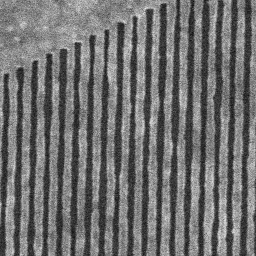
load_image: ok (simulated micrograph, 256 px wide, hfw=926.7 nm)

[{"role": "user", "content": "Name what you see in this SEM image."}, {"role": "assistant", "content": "parallel lines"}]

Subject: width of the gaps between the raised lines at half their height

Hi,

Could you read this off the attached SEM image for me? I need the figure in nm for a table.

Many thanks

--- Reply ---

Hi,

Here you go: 26.3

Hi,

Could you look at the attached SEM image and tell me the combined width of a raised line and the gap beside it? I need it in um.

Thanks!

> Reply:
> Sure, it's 0.0513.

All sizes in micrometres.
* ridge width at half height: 0.0263